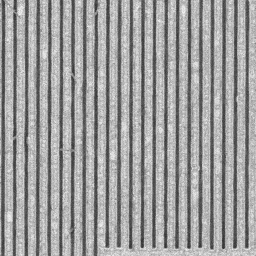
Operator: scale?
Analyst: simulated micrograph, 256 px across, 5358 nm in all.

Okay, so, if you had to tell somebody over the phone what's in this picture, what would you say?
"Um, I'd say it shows parallel lines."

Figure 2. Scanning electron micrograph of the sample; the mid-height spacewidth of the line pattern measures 0.0837 um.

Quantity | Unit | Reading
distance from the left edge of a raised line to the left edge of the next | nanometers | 243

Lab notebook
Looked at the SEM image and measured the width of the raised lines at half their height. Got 165 nm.